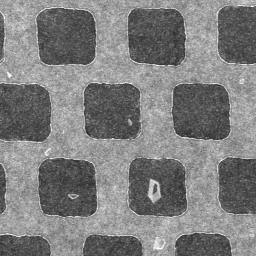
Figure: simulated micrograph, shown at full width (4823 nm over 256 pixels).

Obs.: holes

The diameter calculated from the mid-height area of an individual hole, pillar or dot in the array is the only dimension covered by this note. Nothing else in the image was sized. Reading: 1090 nanometres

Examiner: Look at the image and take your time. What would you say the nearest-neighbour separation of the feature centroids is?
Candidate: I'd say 1620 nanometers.